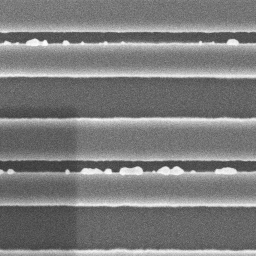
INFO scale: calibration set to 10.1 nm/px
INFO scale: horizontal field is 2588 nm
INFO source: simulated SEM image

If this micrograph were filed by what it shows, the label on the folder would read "lines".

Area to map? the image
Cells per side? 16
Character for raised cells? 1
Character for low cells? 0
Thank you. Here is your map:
1111111111111111
1111111111111111
1111111111111111
1111111111111111
1111111111111111
0000000000000000
0000000000000000
1111111111111111
1111111111111111
1111111111111111
1111111111111111
1111111111111111
1111111111111111
0000000000000000
0000000000000000
0000000000000000